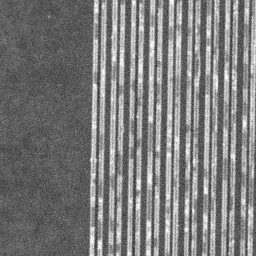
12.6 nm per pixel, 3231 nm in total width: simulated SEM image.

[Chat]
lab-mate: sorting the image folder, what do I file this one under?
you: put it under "parallel lines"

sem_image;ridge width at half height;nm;41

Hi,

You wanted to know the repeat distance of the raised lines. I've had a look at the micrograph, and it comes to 118 nm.